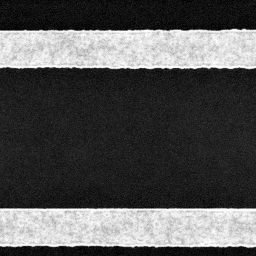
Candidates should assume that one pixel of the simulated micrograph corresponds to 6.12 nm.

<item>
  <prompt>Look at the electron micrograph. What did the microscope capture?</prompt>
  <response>lines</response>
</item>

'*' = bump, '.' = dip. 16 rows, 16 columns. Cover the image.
................
................
****************
****************
................
................
................
................
................
................
................
................
................
****************
****************
................